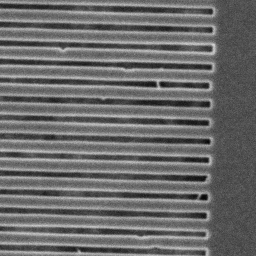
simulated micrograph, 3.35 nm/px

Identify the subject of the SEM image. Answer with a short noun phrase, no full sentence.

parallel lines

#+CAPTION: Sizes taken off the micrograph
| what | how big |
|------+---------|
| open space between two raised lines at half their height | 22.6 nanometers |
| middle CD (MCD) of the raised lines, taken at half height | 39.3 nm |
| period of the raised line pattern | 18.6 pixels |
